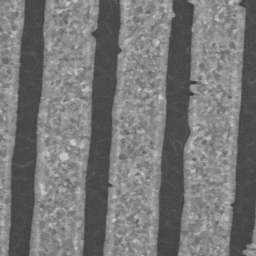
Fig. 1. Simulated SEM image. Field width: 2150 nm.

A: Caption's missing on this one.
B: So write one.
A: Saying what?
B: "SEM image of one or a few lines or trenches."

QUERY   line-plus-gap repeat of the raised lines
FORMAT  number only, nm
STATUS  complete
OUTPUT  622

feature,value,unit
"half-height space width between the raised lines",252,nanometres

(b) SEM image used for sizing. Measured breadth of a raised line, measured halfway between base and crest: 374 nanometres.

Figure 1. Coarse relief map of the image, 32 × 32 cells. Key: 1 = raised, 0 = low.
11100011111100011111100011111100
11100011111100011111100001111100
11100011111100011111100001111100
11000011111000011111100001111100
11000011111000011111100011111100
11000011111000011111100011111100
11000011111000001111100011111100
11000011111000011111100011111100
11000011111000011111000011111100
11000011111000011111000011111100
11000011111000011111000001111100
11000011111000011111000011111100
11000011111000011111000011111100
11000111111000111111000011111000
11000111111000111111000011111000
10000111111000111111000011111000
10000111111000111111000011111000
10000111111000111111000011111000
10000111111000111111000111111000
10000111111000111111000111111000
10000111110000111111000111111000
10000111110000111111000111111000
10000111110000111110000111111000
10000111110000111110000111111000
10000111110000111110000111111000
10000111110000111110000111111000
10000111110000111110000111111000
10000111110000111110000111111000
10001111110000111110000111111000
10001111110000111110000111110000
10001111110000111110000111110000
10001111110001111110000111110001